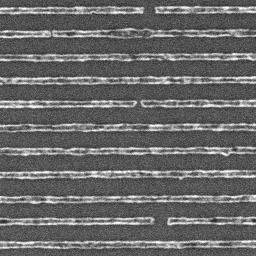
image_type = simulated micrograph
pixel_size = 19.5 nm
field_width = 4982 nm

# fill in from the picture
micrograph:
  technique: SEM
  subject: parallel lines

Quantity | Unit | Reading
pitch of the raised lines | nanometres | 456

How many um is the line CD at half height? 0.102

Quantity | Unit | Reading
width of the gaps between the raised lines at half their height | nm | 343